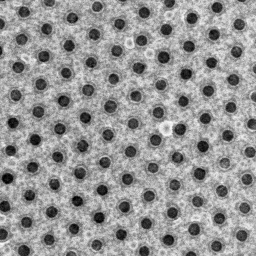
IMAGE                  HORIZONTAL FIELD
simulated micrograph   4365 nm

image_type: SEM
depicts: a regular array of raised bodies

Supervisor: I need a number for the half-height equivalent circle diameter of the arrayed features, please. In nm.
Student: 215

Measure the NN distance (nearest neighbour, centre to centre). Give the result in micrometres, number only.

0.463